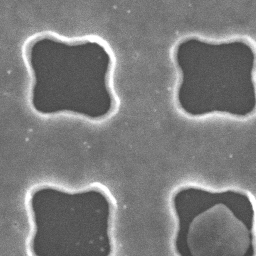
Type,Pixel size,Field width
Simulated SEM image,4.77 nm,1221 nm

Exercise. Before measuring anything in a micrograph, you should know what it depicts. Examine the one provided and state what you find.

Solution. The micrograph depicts holes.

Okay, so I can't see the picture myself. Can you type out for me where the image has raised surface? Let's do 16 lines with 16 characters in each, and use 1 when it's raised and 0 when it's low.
1111111111111111
1111111111111111
1100111111110111
1100000111100000
1100000111100000
1100000111100000
1100000111100000
1111111111111111
1111111111111111
1111111111111111
1111111111111111
1111111111111111
1100000111100000
1100000111100000
1100000111100000
1100000111100000